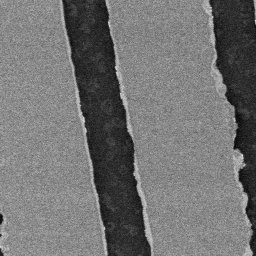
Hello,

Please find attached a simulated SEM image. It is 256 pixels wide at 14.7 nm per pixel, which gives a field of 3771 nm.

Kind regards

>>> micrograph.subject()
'one or a few lines or trenches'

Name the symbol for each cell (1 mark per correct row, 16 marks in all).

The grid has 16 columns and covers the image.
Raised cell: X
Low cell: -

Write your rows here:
XXXX---XXXXXX---
XXXX---XXXXXX---
XXXX---XXXXXX---
XXXX---XXXXXX---
XXXXX--XXXXXX---
XXXXX---XXXXXX--
XXXXX---XXXXXX--
XXXXX---XXXXXXX-
XXXXX---XXXXXXX-
XXXXXX--XXXXXXX-
XXXXXX---XXXXXX-
XXXXXX---XXXXXX-
XXXXXX---XXXXXX-
XXXXXX---XXXXXX-
XXXXXX---XXXXXXX
XXXXXXX--XXXXXXX